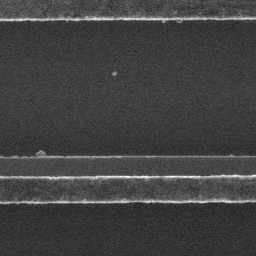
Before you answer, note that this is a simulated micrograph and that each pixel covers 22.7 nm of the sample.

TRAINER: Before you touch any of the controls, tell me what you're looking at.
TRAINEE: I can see lines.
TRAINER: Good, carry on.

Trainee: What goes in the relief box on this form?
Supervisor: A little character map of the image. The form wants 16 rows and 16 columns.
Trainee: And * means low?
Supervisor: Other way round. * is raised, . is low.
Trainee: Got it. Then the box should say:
****************
................
................
................
................
................
................
................
................
................
****************
****************
****************
................
................
................